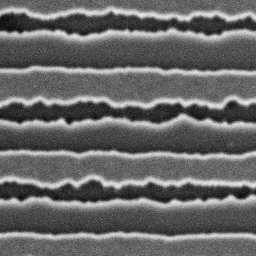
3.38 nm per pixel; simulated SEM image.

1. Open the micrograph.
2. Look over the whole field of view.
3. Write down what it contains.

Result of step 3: lines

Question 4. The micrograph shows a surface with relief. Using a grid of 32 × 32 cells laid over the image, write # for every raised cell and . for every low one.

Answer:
################################
#.##############################
................................
................................
................................
................................
................................
................................
....####........#.#.............
################################
################################
################################
################################
................................
................................
................................
................................
................................
................................
################################
################################
################################
###########.####################
................................
................................
................................
................................
................................
................................
#####################.##########
################################
################################